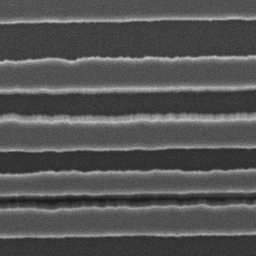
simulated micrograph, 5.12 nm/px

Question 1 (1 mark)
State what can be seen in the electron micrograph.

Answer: lines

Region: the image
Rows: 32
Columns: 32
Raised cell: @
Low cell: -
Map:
@@@@@@@@@@@@@@@@@@@@@@@@@@@@@@@@
@@@@@@@@@@@@@@@@@@@@@@@@@@@@@@@@
@@@@@@@@@@@@@@@@@-@-------------
--------------------------------
--------------------------------
--------------------------------
--------------------------------
-----@@@--@@@@@@@@@@@@@@@@@@@@@@
@@@@@@@@@@@@@@@@@@@@@@@@@@@@@@@@
@@@@@@@@@@@@@@@@@@@@@@@@@@@@@@@@
@@@@@@@@@@@@@@@@@@@@@@@@@@@@@@@@
--------------------------------
--------------------------------
--------------------------------
--------------------------------
@@@@@@@@@@@@@@@@@@@@@@@@@@@@@@@@
@@@@@@@@@@@@@@@@@@@@@@@@@@@@@@@@
@@@@@@@@@@@@@@@@@@@@@@@@@@@@@@@@
@@@@@@@@@@@@@@@@@@@@@@@@--@---@@
--------------------------------
--------------------------------
------@-@@-@@@@@@@@@@@@-@@@@@@@@
@@@@@@@@@@@@@@@@@@@@@@@@@@@@@@@@
@@@@@@@@@@@@@@@@@@@@@@@@@@@@@@@@
@-------------------------------
-------------------------@---@@-
@@@@@@@@@@@@@@@@@@@@@@@@@@@@@@@@
@@@@@@@@@@@@@@@@@@@@@@@@@@@@@@@@
@@@@@@@@@@@@@@@@@@@@@@@@@@@@@@@@
@@@@@@@@@-@@--------------------
--------------------------------
--------------------------------